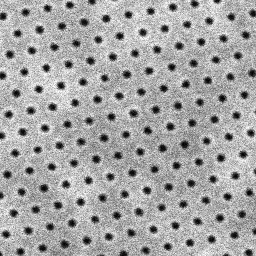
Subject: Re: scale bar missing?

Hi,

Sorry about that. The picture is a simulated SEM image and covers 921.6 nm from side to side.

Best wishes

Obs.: a regular array of holes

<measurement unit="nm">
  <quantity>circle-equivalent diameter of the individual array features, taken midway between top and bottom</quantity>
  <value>30.4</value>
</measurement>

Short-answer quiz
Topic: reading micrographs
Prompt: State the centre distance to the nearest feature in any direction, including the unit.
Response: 79.8 nm